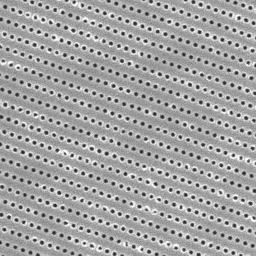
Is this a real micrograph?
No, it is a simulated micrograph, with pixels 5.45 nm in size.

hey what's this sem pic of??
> a regular array of holes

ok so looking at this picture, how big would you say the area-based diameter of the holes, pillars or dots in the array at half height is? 22.2 nm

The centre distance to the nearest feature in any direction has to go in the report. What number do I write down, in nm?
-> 42.7